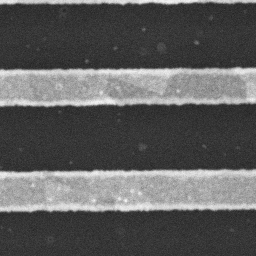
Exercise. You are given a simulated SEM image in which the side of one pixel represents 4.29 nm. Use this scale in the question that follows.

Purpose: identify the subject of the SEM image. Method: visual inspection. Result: lines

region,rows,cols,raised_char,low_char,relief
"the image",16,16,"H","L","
LLLLLLLLLLLLLLLL
LLLLLLLLLLLLLLLL
LLLLLLLLLLLLLLLL
LLLLLLLLLLLLLLLL
HHHHHHHHHHHHHHHH
HHHHHHHHHHHHHHHH
HHHHHHLLLLLLLLLL
LLLLLLLLLLLLLLLL
LLLLLLLLLLLLLLLL
LLLLLLLLLLLLLLLL
LLLLLLLLLLLLLLLL
HHHHHHHHHHHHHHHH
HHHHHHHHHHHHHHHH
LLLLLLLLLLLLLLLL
LLLLLLLLLLLLLLLL
LLLLLLLLLLLLLLLL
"